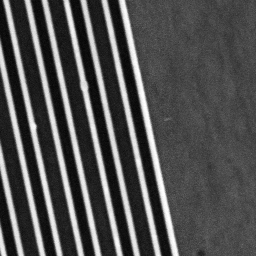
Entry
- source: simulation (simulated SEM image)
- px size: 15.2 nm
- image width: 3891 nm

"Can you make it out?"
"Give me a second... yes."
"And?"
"parallel lines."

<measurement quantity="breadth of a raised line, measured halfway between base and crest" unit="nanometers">78.1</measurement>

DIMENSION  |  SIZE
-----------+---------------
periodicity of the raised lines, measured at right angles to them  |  0.284 micrometres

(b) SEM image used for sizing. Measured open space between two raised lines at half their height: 182 nanometres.